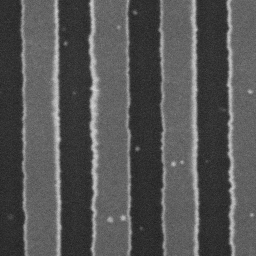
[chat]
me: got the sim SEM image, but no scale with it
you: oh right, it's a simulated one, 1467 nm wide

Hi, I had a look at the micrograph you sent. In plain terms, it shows lines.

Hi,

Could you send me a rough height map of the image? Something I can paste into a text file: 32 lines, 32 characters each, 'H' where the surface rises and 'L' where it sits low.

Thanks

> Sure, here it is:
LLLHHHHLLLLHHHHHLLLLHHHHLLLLHHHH
LLLHHHHLLLLHHHHHLLLLHHHHLLLLLHHH
LLLHHHHLLLLHHHHHLLLLHHHHLLLLLHHH
LLLHHHHLLLLHHHHHLLLLHHHHHLLLLHHH
LLLHHHHLLLLHHHHHLLLLHHHHLLLLHHHH
LLLHHHHLLLLHHHHHLLLLHHHHHLLLHHHH
LLLHHHHLLLLHHHHHLLLLHHHHHLLLLHHH
LLLHHHHLLLLHHHHHLLLLHHHHHLLLLHHH
LLLHHHHLLLLHHHHHLLLLHHHHHLLLLHHH
LLLHHHHLLLLLHHHHLLLLHHHHHLLLLHHH
LLLHHHHLLLLLHHHHLLLLHHHHHLLLLHHH
LLLHHHHLLLLLHHHHLLLLHHHHHLLLLHHH
LLLHHHHLLLLHHHHHLLLLHHHHHLLLLHHH
LLLHHHHLLLLHHHHHLLLLHHHHHLLLLHHH
LLLHHHHLLLLLHHHHLLLLHHHHHLLLLHHH
LLLHHHHLLLLHHHHHLLLLHHHHHLLLLHHH
LLLHHHHLLLLHHHHHLLLLHHHHHLLLLHHH
LLLHHHHLLLLLHHHHLLLLHHHHHLLLLHHH
LLLHHHHLLLLLHHHHLLLLHHHHHLLLLHHH
LLLHHHHLLLLLHHHHLLLLHHHHHLLLLHHH
LLLHHHHLLLLLHHHHLLLLHHHHHLLLLHHH
LLLHHHHLLLLLHHHHLLLLHHHHHLLLLHHH
LLLHHHHLLLLLHHHHLLLLHHHHHLLLLHHH
LLLHHHHLLLLLHHHHLLLLHHHHHLLLLHHH
LLLHHHHLLLLLHHHHLLLLHHHHHLLLLHHH
LLLHHHHLLLLLHHHHLLLLHHHHHLLLLHHH
LLLHHHHLLLLLHHHHLLLLHHHHHLLLLHHH
LLLHHHHLLLLLHHHHLLLLHHHHHLLLLHHH
LLLHHHHHLLLLHHHHLLLLHHHHHLLLLHHH
LLLHHHHLLLLLHHHHLLLLLHHHHLLLLHHH
LLLHHHHLLLLLHHHHLLLLLHHHHLLLLHHH
LLLHHHHLLLLLHHHHLLLLLHHHHLLLLHHH